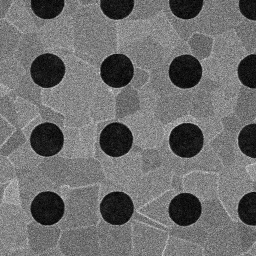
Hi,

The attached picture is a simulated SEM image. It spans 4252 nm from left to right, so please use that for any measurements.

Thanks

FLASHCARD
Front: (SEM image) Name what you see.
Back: a regular array of holes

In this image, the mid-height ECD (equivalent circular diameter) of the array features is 568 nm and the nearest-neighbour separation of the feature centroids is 1140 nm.